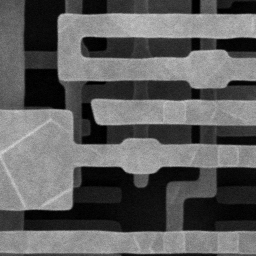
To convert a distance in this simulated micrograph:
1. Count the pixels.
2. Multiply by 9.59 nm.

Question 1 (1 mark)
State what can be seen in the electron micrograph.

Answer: wiring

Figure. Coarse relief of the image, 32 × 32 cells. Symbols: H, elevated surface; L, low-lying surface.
HHHLLLLLHHLLLLLLLHLLLLLLLHHLLLLL
HHHLLLLLHHLLLLLLLHHLLLLLLHHLLLLL
HHHLLLLHHHHHHHHHHHHHHHHHHHHHHHHH
HHHLLLLHHHHHHHHHHHHHHHHHHHHHHHHH
HHHLLLLHHHHHHHHHHHHHHHHHHHHHHHHH
HHHLLLLHHHLLLLLLLHLLLLLLLHHLLLLL
HHHLLLLHHHHLLLLLLHHLLLLLHHHHLLLL
HHHLLLLHHHHHHHHHHHHHHHHHHHHHHHHH
HHHLLLLHHHHHHHHHHHHHHHHHHHHHHHHH
HHHLLLLHHHHHHHHHHHHHHHHHHHHHHHHH
HHHLLLLLHHLLLLLLLHLLLLLLHHHHLLLL
HHHLLLLLHHLLLLLLLHLLLLLLLHHLLLLL
HHHLLLLLHHLLHHHHHHHHLLLHHHHLLLLL
HHHLLLLLHHLHHHHHHHHHHHHHHHHHHHHH
HHHHHHHHHHLLHHHHHHHHHHHHHHHHHHHH
HHHHHHHHHHLLHHHHHHHLHHHHHHHHHHHH
HHHHHHHHHHLLLLLLLHLLLLLLLHHLLLLL
HHHHHHHHHHLLLLLLHHHLLLLLLHHLLLLL
HHHHHHHHHHHHHHHHHHHHHHHHHHHHHHHH
HHHHHHHHHHHHHHHHHHHHHHHHHHHHHHHH
HHHHHHHHHHHHHHHHHHHHHHHHHHHHHHHH
HHHHHHHHHHLLLLLLHHHLLLLLLHHLLLLL
HHHHHHHHHHLLLLLLLHLLLLLLLHHLLLLL
HHHHHHHHHLLLLLLLLLLLLHHHHHHLLLLL
HHHHHHHHHLLLLLLLLLLLLHHHHHLLLLLL
HHHHHHHHHLLLLLLLLLLLLHHLLLLLLLLL
HHHLLLLLLLLLLLLLLLLLLHHLLLLLLLLL
HHHLLLLLLLLLLLLLLLLLLHHLLLLLLLLL
HHHLLLLLLLLLLLLLLLLLLHHLLLLLLLLL
HHHHHHHHHHHHHHHHHHHHHHHHHHHHHHHH
HHHHHHHHHHHHHHHHHHHHHHHHHHHHHHHH
HHHHHHHHHHHHHHHHHHHHHHHHHHHHHHHH